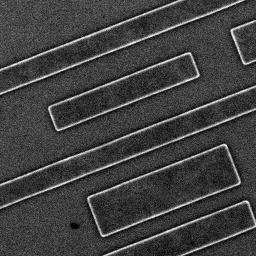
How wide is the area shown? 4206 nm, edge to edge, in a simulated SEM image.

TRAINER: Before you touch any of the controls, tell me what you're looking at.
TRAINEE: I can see groups of lines, slits or small figures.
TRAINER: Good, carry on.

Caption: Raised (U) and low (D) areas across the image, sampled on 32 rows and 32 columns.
DDDDDDDDDDDDDDDDDDDDDUUUUUUUUDDD
DDDDDDDDDDDDDDDDDDDUUUUUUUUDDDDD
DDDDDDDDDDDDDDDDUUUUUUUUDDDDDDDD
DDDDDDDDDDDDDDUUUUUUUUDDDDDDDUUU
DDDDDDDDDDDUUUUUUUUDDDDDDDDDDUUU
DDDDDDDDUUUUUUUUDDDDDDDDDDDDDUUU
DDDDDDUUUUUUUUDDDDDDDDDDDDDDDDUU
DDDUUUUUUUUDDDDDDDDDDUUUDDDDDDUU
DUUUUUUUUDDDDDDDDDDUUUUUUDDDDDDD
UUUUUUDDDDDDDDDDUUUUUUUUUDDDDDDD
UUUDDDDDDDDDDUUUUUUUUUDDDDDDDDDD
UDDDDDDDDDDUUUUUUUUUDDDDDDDDDDUU
DDDDDDDDUUUUUUUUUDDDDDDDDDDUUUUU
DDDDDDUUUUUUUUUDDDDDDDDDDUUUUUUU
DDDDDDUUUUUUDDDDDDDDDDUUUUUUUUDD
DDDDDDDUUUDDDDDDDDDUUUUUUUUDDDDD
DDDDDDDDDDDDDDDDDUUUUUUUUDDDDDDD
DDDDDDDDDDDDDDUUUUUUUUDDDDDDDDDD
DDDDDDDDDDDDUUUUUUUUDDDDDDDUDDDD
DDDDDDDDDUUUUUUUUDDDDDDDUUUUUDDD
DDDDDDDUUUUUUUDDDDDDDDUUUUUUUDDD
DDDDUUUUUUUUDDDDDDDUUUUUUUUUUUDD
DUUUUUUUUDDDDDDDUUUUUUUUUUUUUUDD
UUUUUUUDDDDDDDUUUUUUUUUUUUUUUDDD
UUUUDDDDDDDUUUUUUUUUUUUUUUDDDDDD
UDDDDDDDDDDUUUUUUUUUUUUDDDDDDDUD
DDDDDDDDDDDDUUUUUUUUUDDDDDDUUUUU
DDDDDDDDDDDDUUUUUUDDDDDDUUUUUUUU
DDDDDDDDDDDDUUUUDDDDDDUUUUUUUUUU
DDDDDDDDDDDDDDDDDDDUUUUUUUUUUDDD
DDDDDDDDDDDDDDDDDUUUUUUUUUUDDDDD
DDDDDDDDDDDDDDUUUUUUUUUUDDDDDDDD